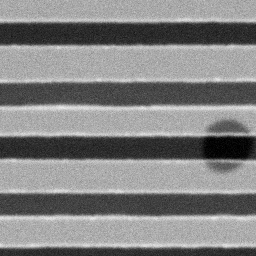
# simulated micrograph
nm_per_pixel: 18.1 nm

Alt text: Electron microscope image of lines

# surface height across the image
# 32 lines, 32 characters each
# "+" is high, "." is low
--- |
++++++++++++++++++++++++++++++++
++++++++++++++++++++++++++++++++
++++++++++++++++++++++++++++++++
................................
................................
................................
++++++++++++++++++++++++++++++++
++++++++++++++++++++++++++++++++
++++++++++++++++++++++++++++++++
++++++++++++++++++++++++++++++++
................................
................................
................................
..+.++.++.+......+.++..........+
++++++++++++++++++++++++++++++++
++++++++++++++++++++++++++++++++
++++++++++++++++++++++++++++++++
................................
................................
................................
++++++++++++++++++++++++++++++++
++++++++++++++++++++++++++++++++
++++++++++++++++++++++++++++++++
++++++++++++++++++++++++++++++++
................................
................................
................................
++++++++++++++++++++++++++++++++
++++++++++++++++++++++++++++++++
++++++++++++++++++++++++++++++++
++++++++++++++++++++++++++++++++
................................